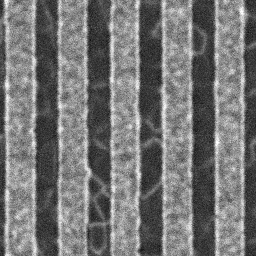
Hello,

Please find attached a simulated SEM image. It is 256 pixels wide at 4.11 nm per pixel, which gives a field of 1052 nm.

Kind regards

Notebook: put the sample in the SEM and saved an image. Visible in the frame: parallel lines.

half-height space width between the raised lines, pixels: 25.5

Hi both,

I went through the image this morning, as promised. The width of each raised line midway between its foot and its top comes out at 26.5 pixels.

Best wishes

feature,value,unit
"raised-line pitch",0.215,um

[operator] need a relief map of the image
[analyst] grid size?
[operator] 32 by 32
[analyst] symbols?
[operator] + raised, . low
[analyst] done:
.+++...++++...+++...++++...+++..
.+++...++++...+++...++++...+++..
.+++...++++...+++...++++...+++..
.+++...++++...+++...++++...+++..
.+++...++++...+++...++++...+++..
.+++...++++...+++...++++...+++..
.+++...++++...+++...++++...+++..
++++...++++...+++...++++...+++..
.+++....+++...+++...++++...+++..
.+++...++++...+++...++++...+++..
.+++....+++...+++...++++...+++..
.+++...++++...+++...++++...+++..
.+++...++++...+++...++++...+++..
.+++....+++...+++....+++...+++..
.+++....+++...+++...++++...+++..
.+++....+++...+++....+++...+++..
.+++...++++...+++....+++...+++..
.+++....+++...+++....+++...+++..
.+++....+++...+++....+++...+++..
.+++..+.+++...+++....+++...+++..
.+++..+++++...+++....+++...+++..
.+++...++++...+++...++++...+++..
.+++...++++...+++...++++...+++..
.+++...++++...+++....+++...+++..
.+++...++++...+++....+++...+++..
.+++...++++...+++....+++...+++..
.+++...++++...+++....+++...+++..
.+++...++++...+++....+++...+++..
.+++...++++++.+++....+++...+++..
.+++....+++++.+++...++++...+++..
.+++....++++..+++...++++...+++..
.+++...++++...+++...++++...+++..